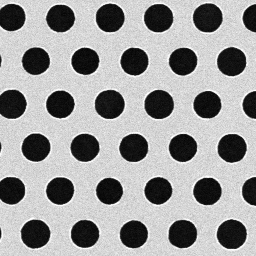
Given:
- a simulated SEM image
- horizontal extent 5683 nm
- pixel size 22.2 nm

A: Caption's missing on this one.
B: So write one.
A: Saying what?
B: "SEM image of a regular array of holes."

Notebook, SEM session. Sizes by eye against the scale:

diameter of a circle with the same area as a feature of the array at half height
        634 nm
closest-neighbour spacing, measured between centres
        1090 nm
